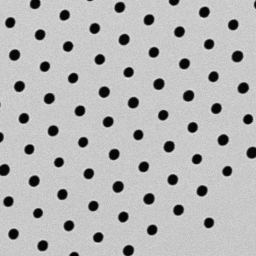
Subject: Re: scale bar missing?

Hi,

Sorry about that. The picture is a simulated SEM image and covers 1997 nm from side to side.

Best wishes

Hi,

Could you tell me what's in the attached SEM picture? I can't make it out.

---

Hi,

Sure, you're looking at a regular array of holes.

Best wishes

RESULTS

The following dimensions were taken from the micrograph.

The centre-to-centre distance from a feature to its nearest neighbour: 243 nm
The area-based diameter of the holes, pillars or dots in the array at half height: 83.9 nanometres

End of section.